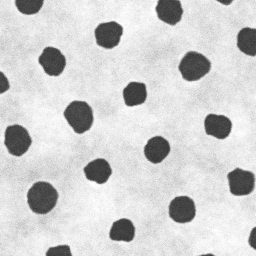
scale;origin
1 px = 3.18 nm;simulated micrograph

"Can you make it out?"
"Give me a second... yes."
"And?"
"a regular array of holes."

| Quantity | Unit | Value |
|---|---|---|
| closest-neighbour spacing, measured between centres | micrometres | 0.195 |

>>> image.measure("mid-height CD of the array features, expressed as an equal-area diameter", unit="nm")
87.8